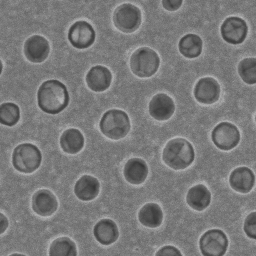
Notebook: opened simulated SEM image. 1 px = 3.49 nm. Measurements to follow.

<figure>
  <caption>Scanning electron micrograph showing a regular array of holes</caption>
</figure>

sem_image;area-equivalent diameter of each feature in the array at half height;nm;91.3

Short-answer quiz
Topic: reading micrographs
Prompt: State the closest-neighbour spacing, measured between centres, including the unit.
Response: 165 nm